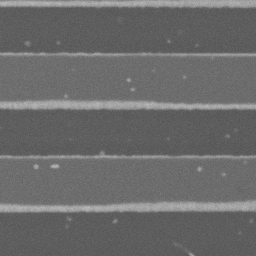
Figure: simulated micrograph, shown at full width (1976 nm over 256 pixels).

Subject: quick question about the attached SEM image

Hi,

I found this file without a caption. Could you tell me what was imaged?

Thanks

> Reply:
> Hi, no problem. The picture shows lines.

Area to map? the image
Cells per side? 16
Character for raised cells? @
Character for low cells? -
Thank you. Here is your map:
----------------
----------------
----------------
@@@@@@@@@@@@@@@@
@@@@@@@@@@@@@@@@
@@@@@@@@@@@@@@@@
@@@@@@@@@@@@@@@@
----------------
----------------
----------------
@@@@@@@@@@@@@@@@
@@@@@@@@@@@@@@@@
@@@@@@@@@@@@@@@@
----------------
----------------
----------------